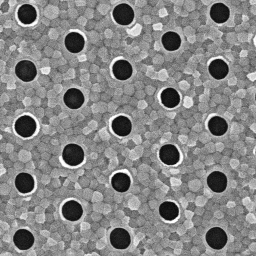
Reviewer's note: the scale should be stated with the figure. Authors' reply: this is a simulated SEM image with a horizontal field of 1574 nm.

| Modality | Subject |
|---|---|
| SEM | a regular array of holes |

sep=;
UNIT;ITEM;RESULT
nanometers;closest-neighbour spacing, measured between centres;340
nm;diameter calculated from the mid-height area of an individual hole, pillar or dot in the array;129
